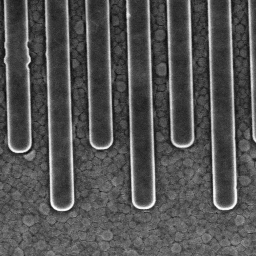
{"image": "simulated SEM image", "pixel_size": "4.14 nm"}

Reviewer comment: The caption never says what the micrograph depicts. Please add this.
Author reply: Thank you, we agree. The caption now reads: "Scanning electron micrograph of parallel lines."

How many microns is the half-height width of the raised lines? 0.0925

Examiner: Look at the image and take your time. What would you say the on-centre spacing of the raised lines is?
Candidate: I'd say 168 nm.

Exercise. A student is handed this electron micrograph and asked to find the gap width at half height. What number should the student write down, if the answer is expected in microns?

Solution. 0.076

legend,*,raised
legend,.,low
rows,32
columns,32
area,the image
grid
.**...**...***..***..***..***..*
.**...**...***..***..***..***..*
.**...***..***..***..***..***..*
.**...***..***..***..***..***..*
.**...***..***..***..***..***..*
.**...***..***..***..***..***..*
.***..***..***..***..***..***..*
.***..***..***..***..***..***..*
.***..***..***..***..***..***..*
.***..***..***..***..***..***..*
.***..***..***..***..***..***...
.***..***..***..***..***..***...
.***..***..***..***..***..***...
.***..***..***..***..***..***...
.***..***..***..***..***..***...
.***..***..***..***..***..***...
.***..***..***..***...**..***...
.***..***..***..***...**...**...
.***..***...*...***........**...
......***.......***........**...
......***.......***........**...
......***.......***........**...
......***.......***........**...
......***........**........**...
......***........**........***..
.......**........**........**...
................................
................................
................................
................................
................................
................................